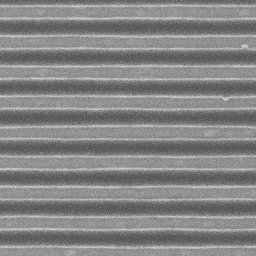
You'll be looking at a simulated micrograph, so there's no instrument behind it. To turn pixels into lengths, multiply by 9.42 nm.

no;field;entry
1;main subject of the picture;parallel lines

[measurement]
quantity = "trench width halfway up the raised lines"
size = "112 nm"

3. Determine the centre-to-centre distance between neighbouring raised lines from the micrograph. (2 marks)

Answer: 284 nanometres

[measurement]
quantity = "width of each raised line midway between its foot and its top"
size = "176 nm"